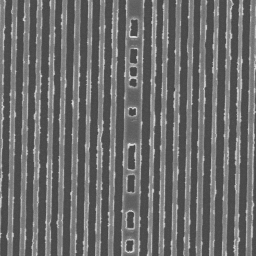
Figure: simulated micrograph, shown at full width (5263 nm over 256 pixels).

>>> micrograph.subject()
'parallel lines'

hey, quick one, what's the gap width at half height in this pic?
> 157 nanometers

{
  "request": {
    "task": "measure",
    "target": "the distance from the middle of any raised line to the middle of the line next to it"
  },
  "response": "0.258 µm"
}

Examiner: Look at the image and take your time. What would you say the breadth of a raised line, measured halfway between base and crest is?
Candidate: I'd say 105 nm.